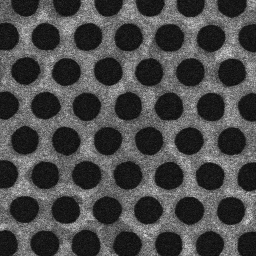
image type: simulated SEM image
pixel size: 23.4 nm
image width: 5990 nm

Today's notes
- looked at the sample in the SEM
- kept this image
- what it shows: a regular array of holes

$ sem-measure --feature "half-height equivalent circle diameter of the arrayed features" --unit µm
0.668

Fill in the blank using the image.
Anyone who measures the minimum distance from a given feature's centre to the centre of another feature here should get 39.9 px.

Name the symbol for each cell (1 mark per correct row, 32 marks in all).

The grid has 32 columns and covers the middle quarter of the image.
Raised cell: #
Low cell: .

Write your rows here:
....####......####......####....
....###........###.......###....
....###........##........###....
....####.......###.......###....
...######....######.....#####...
.###################...#######..
################################
####...#######....#######...####
###......####......#####.....###
##.......####......####.......##
##.......####.......###.......##
##.......####......####.......##
##.......####......####......###
####....######....######.....###
################################
################################
...######....######.....#####...
....####......####.......###....
....###........###.......###....
....###.......####.......##.....
....####......####.......###....
...#####.....######.....####....
..#######...########...#######..
################################
#####..########..########..#####
###......####......#####.....###
##.......###.......####.......##
##.......###........###.......##
##.......###........##........##
###......####......####.......##
####....######.....####......###
#########################..#####